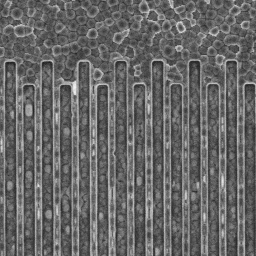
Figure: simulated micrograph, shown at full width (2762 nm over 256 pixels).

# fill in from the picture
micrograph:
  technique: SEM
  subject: parallel lines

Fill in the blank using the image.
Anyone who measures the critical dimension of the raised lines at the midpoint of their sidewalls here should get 66.1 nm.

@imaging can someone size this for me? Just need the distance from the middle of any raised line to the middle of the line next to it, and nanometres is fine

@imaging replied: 199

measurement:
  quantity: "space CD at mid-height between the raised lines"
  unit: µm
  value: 0.132